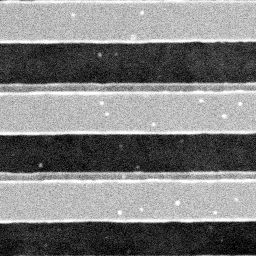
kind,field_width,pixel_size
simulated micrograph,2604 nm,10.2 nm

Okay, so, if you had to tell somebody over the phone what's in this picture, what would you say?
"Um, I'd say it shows lines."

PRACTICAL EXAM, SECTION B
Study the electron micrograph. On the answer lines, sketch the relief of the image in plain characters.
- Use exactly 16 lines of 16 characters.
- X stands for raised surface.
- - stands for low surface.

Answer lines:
XXXXXXXXXXXXXXXX
XXXXXXXXXXXXXXXX
XXXXXXXXXXXXXXXX
----------------
----------------
XXXXXXXXXXXXXXXX
XXXXXXXXXXXXXXXX
XXXXXXXXXXXXXXXX
----------------
----------------
----------------
XXXXXXXXXXXXXXXX
XXXXXXXXXXXXXXXX
XXXXXXXXXXXXXXXX
----------------
----------------